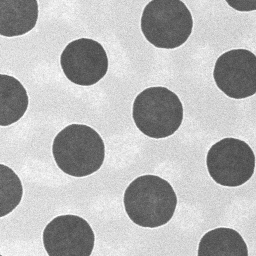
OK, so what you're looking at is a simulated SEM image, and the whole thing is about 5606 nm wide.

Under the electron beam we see holes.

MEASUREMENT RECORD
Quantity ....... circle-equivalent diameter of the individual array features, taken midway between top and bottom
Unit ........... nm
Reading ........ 1150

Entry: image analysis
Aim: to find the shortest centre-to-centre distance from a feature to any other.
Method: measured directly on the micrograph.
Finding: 87.7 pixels